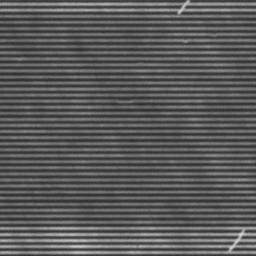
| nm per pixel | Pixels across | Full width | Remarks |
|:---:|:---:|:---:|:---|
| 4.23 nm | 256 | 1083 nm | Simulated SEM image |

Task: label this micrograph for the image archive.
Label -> parallel lines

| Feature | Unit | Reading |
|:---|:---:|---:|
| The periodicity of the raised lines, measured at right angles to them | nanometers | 25.7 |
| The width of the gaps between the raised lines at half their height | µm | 0.0153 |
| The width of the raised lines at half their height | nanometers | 11.1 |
